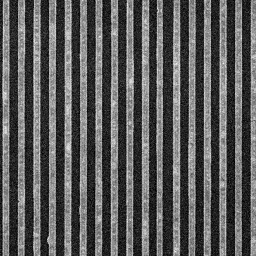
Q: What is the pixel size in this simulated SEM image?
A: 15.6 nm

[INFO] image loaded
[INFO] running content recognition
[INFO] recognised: parallel lines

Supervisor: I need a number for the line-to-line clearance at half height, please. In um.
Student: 0.146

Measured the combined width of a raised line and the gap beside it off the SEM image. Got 242 nanometers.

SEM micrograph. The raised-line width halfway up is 0.0916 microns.